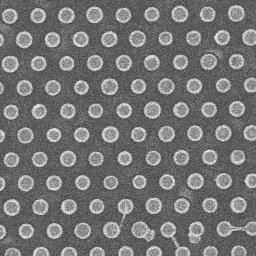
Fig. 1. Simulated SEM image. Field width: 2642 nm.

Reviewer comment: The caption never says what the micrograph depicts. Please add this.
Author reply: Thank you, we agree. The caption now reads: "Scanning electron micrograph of a regular array of raised bodies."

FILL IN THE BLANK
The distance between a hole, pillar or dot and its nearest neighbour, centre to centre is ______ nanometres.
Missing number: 284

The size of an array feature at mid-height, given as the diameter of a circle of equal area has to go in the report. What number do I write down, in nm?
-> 144